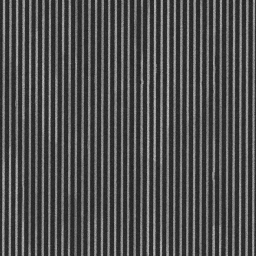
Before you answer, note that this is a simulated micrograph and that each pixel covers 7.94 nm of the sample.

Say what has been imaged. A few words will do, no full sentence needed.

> parallel lines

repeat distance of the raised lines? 52.2 nanometers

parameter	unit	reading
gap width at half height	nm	36.7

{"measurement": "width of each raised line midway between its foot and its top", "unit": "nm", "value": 15.9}